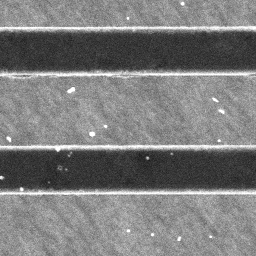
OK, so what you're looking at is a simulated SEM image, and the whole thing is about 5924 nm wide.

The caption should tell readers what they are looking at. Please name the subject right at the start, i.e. lines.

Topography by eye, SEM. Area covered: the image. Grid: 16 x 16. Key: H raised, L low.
LLLLLLLLLLLLLLLL
LLLLLLLLLLLLLLLL
HHHHHHHHHHHHHHHH
HHHHHHHHHHHHHHHH
HHHHHHHHHHHHHHHH
LLLLLLLLLLLLLLLL
LLLLLLLLLLLLLLLL
LLLLLLLLLLLLLLLL
LLLLLLLLLLLLLLLL
HHHHHHHHHHHHHHHH
HHHHHHHHHHHHHHHH
HHHHHHHHHHHHHHHH
LLLLLLLLLLLLLLLL
LLLLLLLLLLLLLLLL
LLLLLLLLLLLLLLLL
LLLLLLLLLLLLLLLL